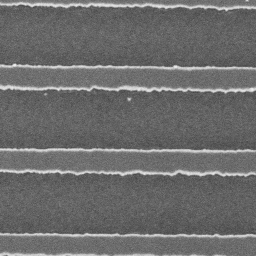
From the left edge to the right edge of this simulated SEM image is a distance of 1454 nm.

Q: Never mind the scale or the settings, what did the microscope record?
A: lines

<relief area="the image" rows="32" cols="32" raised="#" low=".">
################################
................................
................................
................................
................................
................................
................................
................................
################################
################################
################################
................................
................................
................................
................................
................................
................................
................................
................................
################################
################################
..#.##.#########################
................................
................................
................................
................................
................................
................................
................................
################################
################################
################################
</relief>